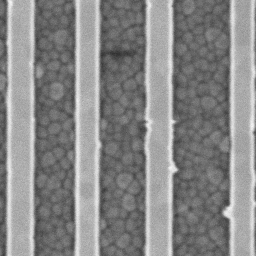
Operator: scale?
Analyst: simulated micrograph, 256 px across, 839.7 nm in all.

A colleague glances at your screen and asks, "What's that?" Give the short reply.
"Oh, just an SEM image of one or a few lines or trenches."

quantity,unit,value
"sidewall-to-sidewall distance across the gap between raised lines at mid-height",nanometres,166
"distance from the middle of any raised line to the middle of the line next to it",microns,0.242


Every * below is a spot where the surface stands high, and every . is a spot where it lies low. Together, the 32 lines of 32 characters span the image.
.***......**.......**........***
.***......**.......**........***
.***......**.......**........***
.***......**.......**........***
.***......**.......**........***
.***......**.......**........***
.***......**.......**........***
.***......**.......**........***
.***......**.......**........***
.***......**......***........***
.***......**......***........***
.***......**.......**........***
.***......**.......**........***
.***......**......***........***
.***......**......***........***
.***......**.......**........**.
.***......**.......**........**.
.***......**......***........**.
.***......**......***........**.
.***......**......***........**.
.***......**.......***.......**.
.***......**.......***.......***
.***......**.......**........***
.***......**.......**........***
.***......**.......**........**.
.***......**.......**........***
.***......**......***.......****
.***......**......***........***
.***......**......***........**.
.***......**......***........**.
.***......**......***........**.
.***......**......***........***